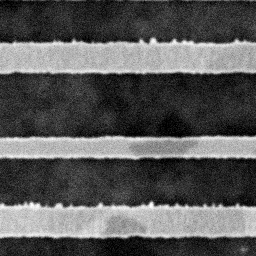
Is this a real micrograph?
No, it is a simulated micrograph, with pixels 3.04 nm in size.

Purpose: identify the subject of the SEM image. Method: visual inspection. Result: lines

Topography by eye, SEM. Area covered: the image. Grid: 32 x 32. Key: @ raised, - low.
--------------------------------
--------------------------------
--------------------------------
--------------------------------
--------------------------------
@@@@@@@@@@@@@@@@@@@@@@@@@@@--@@@
@@@@@@@@@@@@@@@@@@@@@@@@@@@@@@@@
@@@@@@@@@@@@@@@@@@@@@@@@@@@@@@@@
@@@@@@@@@@@@@@@@@@@@@@@@@@@@@@@@
--------------------------------
--------------------------------
--------------------------------
--------------------------------
--------------------------------
--------------------------------
--------------------------------
--------------------------------
@@@@@@@@@@@@@@@@@@@@@@@@@@@@@@@@
@@@@@@@@@@@@@@@@@@@@@@@@@@@@@@@@
@@@@@@@@@@@@@@@@@@@@@@@@@@@@@@@@
--------------------------------
--------------------------------
--------------------------------
--------------------------------
--------------------------------
--------------------------------
@@@@@@@@@@@@@@@@@@@@@@@@@@@@@@@@
@@@@@@@@@@@@@@@@@@@@@@@@@@@@@@@@
@@@@@@@@@@@@@@@@@@@@@@@@@@@@@@@@
@@@@@@@@@@@@@@@@--@@@@@@@@@@@@@@
--------------------------------
--------------------------------